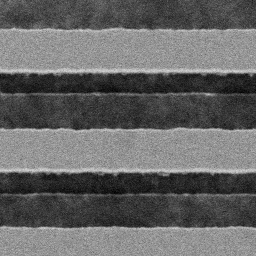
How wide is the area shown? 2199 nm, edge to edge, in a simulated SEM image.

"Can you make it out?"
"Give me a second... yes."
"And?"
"lines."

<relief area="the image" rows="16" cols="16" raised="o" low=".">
................
................
oooooooooooooooo
oooooooooooooooo
oooooooo.ooooooo
................
................
................
oooooooooooooooo
oooooooooooooooo
oooooooooooooooo
................
................
................
oooooooooooooooo
oooooooooooooooo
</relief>